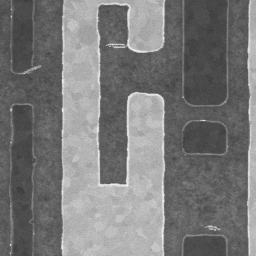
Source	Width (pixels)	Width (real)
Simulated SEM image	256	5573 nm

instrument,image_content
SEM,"one or a few lines or trenches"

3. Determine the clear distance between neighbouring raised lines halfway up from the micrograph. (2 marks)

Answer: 28.2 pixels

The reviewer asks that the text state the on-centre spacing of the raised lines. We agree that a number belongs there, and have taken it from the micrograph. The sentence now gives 1330 nm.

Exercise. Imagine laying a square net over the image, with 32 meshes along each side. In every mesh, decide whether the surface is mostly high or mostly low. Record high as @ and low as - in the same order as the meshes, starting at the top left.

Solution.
-@@@----@@@@@@-@@@@@---@@@@@---@
--@@----@@@@----@@@@---@@@@@---@
-@@@----@@@@----@@@@---@@@@@---@
-@@@----@@@@----@@@@---@@@@@---@
-@@@----@@@@----@@@@---@@@@@---@
-@@@----@@@@----@@@@---@@@@@---@
-@@@----@@@@-----------@@@@@---@
-@@@----@@@@-----------@@@@@---@
-@@@----@@@@-----------@@@@@---@
--------@@@@-----------@@@@@---@
--------@@@@-----------@@@@@---@
--------@@@@-----------@@@@@---@
--------@@@@----@@@@---@@@@@---@
-@@@----@@@@----@@@@-----------@
-@@@----@@@@----@@@@-----------@
-@@@----@@@@----@@@@---@@@@@---@
--@@----@@@@----@@@@---@@@@@---@
-@@@----@@@@----@@@@---@@@@@---@
-@@@----@@@@----@@@@---@@@@@---@
-@@@----@@@@----@@@@-----------@
-@@@----@@@@----@@@@@----------@
-@@@----@@@@----@@@@@----------@
-@@@----@@@@----@@@@-----------@
-@@@----@@@@@@@@@@@@-----------@
-@@@----@@@@@@@@@@@@-----------@
-@@@----@@@@@@@@@@@@-----------@
-@@@----@@@@@@@@@@@@-----------@
-@@@----@@@@@@@@@@@@-----------@
--@@----@@@@@@@@@@@@-----------@
--@@----@@@@@@@@@@@@---@@@@@---@
-@@@----@@@@@@@@@@@@---@@@@@---@
-@@@----@@@@@@@@@@@@---@@@@@---@